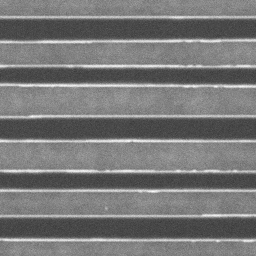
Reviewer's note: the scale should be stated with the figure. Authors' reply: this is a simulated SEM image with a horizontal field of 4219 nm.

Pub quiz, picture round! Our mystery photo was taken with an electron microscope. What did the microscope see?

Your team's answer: lines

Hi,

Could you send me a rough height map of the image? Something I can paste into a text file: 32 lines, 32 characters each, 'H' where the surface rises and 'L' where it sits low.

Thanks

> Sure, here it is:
LLLLLLLLLLLLLLLLLLLLLLLLLLLLLLLL
LLLLLLLLLLLLLLLLLLLLLLLLLLLLLLLL
HHHHHHHHHHHHHHHHHHHHHHHHHHHHHHHH
HHHHHHHHHHHHHHHHHHHHHHHHHHHHHHHH
HHHHHHHHHHHHHHHHHHHHHHHHHHHHHHHH
LLLLLLLLLLLLLLLLLLLLLLLLLLLLLLLL
LLLLLLLLLLLLLLLLLLLLLLLLLLLLLLLL
LLLLLLLLLLLLLLLLLLLLLLLLLLLLLLLL
HHHHHHHHHHHHHHHHHHHHHHHHHHHHHHHH
HHHHHHHHHHHHHHHHHHHHHHHHHHHHHHHH
HHHHHHHHHHHHHHHHHHHHHHHHHHHHHHHH
LLLLLLLLLLLLLLLLLLLLLLLLLLLLLLLL
LLLLLLLLLLLLLLLLLLLLLLLLLLLLLLLL
LLLLLLLLLLLLLLLLLLLLLLLLLLLLLLLL
LLLLLLLLLLLLLLLLLLLLLLLLLLLLLLLL
HHHHHHHHHHHHHHHHHHHHHHHHHHHHHHHH
HHHHHHHHHHHHHHHHHHHHHHHHHHHHHHHH
HHHHHHHHHHHHHHHHHHHHHHHHHHHHHHHH
LLLLLLLLLLLLLLLLLLLLLLLLLLLLLLLL
LLLLLLLLLLLLLLLLLLLLLLLLLLLLLLLL
LLLLLLLLLLLLLLLLLLLLLLLLLLLLLLLL
HHHHHHHHHHHHHHHHHHHHHHHHHHHHHHHH
HHHHHHHHHHHHHHHHHHHHHHHHHHHHHHHH
HHHHHHHHHHHHHHHHHHHHHHHHHHHHHHHH
LLLLLLLLLLLLLLLLLLLLLLLLLLLLLLLL
LLLLLLLLLLLLLLLLLLLLLLLLLLLLLLLL
LLLLLLLLLLLLLLLLLLLLLLLLLLLLLLLL
HHHHHHHHHHHHHHHHHHHHHHHHHHHHHHHH
HHHHHHHHHHHHHHHHHHHHHHHHHHHHHHHH
HHHHHHHHHHHHHHHHHHHHHHHHHHHHHHHH
LLLLLLLLLLLLLLLLLLLLLLLLLLLLLLLL
LLLLLLLLLLLLLLLLLLLLLLLLLLLLLLLL